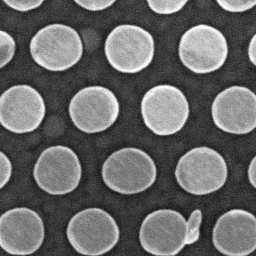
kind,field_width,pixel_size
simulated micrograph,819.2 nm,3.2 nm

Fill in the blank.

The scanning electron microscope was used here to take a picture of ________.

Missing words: a regular array of raised bodies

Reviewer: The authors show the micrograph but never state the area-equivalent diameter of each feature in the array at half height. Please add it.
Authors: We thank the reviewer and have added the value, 152 nm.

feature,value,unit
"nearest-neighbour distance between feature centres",228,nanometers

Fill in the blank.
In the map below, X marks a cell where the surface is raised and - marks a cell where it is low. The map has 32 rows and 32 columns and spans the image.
-XXXX-----XXXX-----XXXX----XXXXX
--------------------X-----------
--------------------------------
------XXX------XX-------XX------
X---XXXXXX----XXXXX----XXXXX----
XX--XXXXXX---XXXXXX----XXXXX---X
XX--XXXXXX---XXXXXX---XXXXXX---X
X---XXXXXX----XXXXX----XXXXX----
------XX-------XXX------XXX-----
--------------------------------
--------------------------------
-XXXX-----XXXX-----XXX------XXX-
XXXXX----XXXXX----XXXXX----XXXXX
XXXXX----XXXXXX---XXXXX----XXXXX
XXXXX----XXXXXX---XXXXX----XXXXX
XXXXX----XXXXX----XXXXX----XXXXX
--X----------------XXX------XXX-
--------------------------------
------XX-----------------X------
X----XXXX-----XXXX-----XXXX-----
X---XXXXXX---XXXXXX---XXXXXX---X
X---XXXXXX---XXXXXX---XXXXXX---X
X---XXXXXX---XXXXXX---XXXXXX---X
-----XXXX-----XXXX-----XXXX-----
--------------------------------
--------------------------------
-XXX------XXX-------XX-------X--
XXXXX----XXXXX----XXXXX----XXXXX
XXXXX----XXXXXX---XXXXXXX--XXXXX
XXXXX---XXXXXXX---XXXXXX---XXXXX
XXXXX----XXXXX----XXXXX----XXXXX
-XXX------XXX------XXX------XXX-